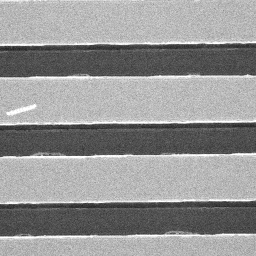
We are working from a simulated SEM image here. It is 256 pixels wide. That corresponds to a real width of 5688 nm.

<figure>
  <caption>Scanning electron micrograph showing lines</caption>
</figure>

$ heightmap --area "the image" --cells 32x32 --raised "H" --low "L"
HHHHHHHHHHHHHHHHHHHHHHHHHHHHHHHH
HHHHHHHHHHHHHHHHHHHHHHHHHHHHHHHH
HHHHHHHHHHHHHHHHHHHHHHHHHHHHHHHH
HHHHHHHHHHHHHHHHHHHHHHHHHHHHHHHH
HHHHHHHHHHHHHHHHHHHHHHHHHHHHHHHH
HHHHHHHHHHHHLHHHHLHHHLLLLLLLLLLL
LLLLLLLLLLLLLLLLLLLLLLLLLLLLLLLL
LLLLLLLLLLLLLLLLLLLLLLLLLLLLLLLL
LLLLLLLLLLLLLLLLLLLLLLLLLLLLLLLL
LLLLLLLLLLLLLLLLLLLLLLLLLLLLLLHH
HHHHHHHHHHHHHHHHHHHHHHHHHHHHHHHH
HHHHHHHHHHHHHHHHHHHHHHHHHHHHHHHH
HHHHHHHHHHHHHHHHHHHHHHHHHHHHHHHH
HHHHHHHHHHHHHHHHHHHHHHHHHHHHHHHH
HHHHHHHHHHHHHHHHHHHHHHHHHHHHHHHH
HHLLLLLLLLLLLLLLLLLLLLLLLLLLLLLL
LLLLLLLLLLLLLLLLLLLLLLLLLLLLLLLL
LLLLLLLLLLLLLLLLLLLLLLLLLLLLLLLL
LLLLLLLLLLLLLLLLLLLLLLLLLLLLLLLL
LLLLLLLLLLLHHHHHHHHHHHHHHHHHHHHH
HHHHHHHHHHHHHHHHHHHHHHHHHHHHHHHH
HHHHHHHHHHHHHHHHHHHHHHHHHHHHHHHH
HHHHHHHHHHHHHHHHHHHHHHHHHHHHHHHH
HHHHHHHHHHHHHHHHHHHHHHHHHHHHHHHH
HHHHHHHHHHHHHHHHHHHHHHHHHHHHHHHH
LLLLLLLLLLLLLLLLLLLLLLLLLLLLLLLL
LLLLLLLLLLLLLLLLLLLLLLLLLLLLLLLL
LLLLLLLLLLLLLLLLLLLLLLLLLLLLLLLL
LLLLLLLLLLLLLLLLLLLLLLLLLLLLLLLL
LLLLLLLLLLLLLLLLHHHHHHHHHHHHHHHH
HHHHHHHHHHHHHHHHHHHHHHHHHHHHHHHH
HHHHHHHHHHHHHHHHHHHHHHHHHHHHHHHH